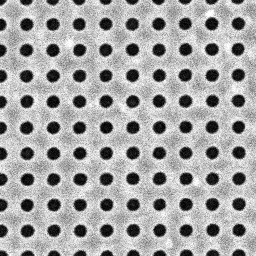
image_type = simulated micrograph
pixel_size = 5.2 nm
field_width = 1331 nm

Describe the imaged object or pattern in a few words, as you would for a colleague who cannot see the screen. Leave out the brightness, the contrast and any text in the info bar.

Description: a regular array of holes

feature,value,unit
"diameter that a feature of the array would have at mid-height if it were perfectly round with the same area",71.1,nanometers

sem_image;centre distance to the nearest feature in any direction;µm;0.133